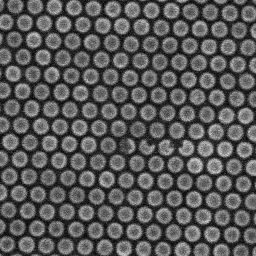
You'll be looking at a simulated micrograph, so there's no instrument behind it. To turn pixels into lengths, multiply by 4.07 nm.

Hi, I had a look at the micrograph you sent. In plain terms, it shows a regular array of raised bodies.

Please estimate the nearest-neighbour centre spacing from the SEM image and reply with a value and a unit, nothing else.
0.0783 micrometres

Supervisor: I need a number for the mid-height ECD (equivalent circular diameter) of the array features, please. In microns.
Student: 0.0586